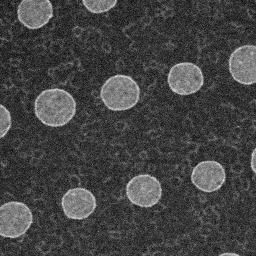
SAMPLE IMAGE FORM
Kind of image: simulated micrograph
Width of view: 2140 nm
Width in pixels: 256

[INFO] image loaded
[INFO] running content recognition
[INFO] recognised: raised bodies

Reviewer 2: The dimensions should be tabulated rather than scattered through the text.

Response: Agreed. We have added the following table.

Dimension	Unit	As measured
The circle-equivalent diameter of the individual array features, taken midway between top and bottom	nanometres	275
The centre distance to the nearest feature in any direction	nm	557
